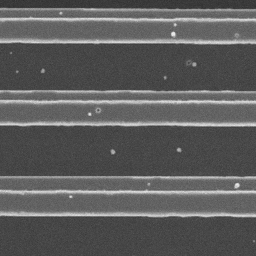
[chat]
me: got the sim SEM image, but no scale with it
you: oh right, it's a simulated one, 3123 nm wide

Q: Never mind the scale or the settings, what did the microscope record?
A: lines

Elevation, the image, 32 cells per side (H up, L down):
LLLLLLLLLLLLLLLLLLLLLLLLLLLLLLLL
HHHHHHHHHHHHHHHHHHHHHHHHHHHHHHHH
HHHHHHHHHHHHHHHHHHHHHHHHHHHHHHHH
HHHHHHHHHHHHHHHHHHHHHHHHHHHHHHHH
HHHHHHHHHHHHHHHHHHHHHHHHHHHHHHHH
LLLLLLLLLLLLLLLLLLLLLLLLLLLLLLLL
LLLLLLLLLLLLLLLLLLLLLLLLLLLLLLLL
LLLLLLLLLLLLLLLLLLLLLLLLLLLLLLLL
LLLLLLLLLLLLLLLLLLLLLLLLLLLLLLLL
LLLLLLLLLLLLLLLLLLLLLLLLLLLLLLLL
LLLLLLLLLLLLLLLLLLLLLLLLLLLLLLLL
HHHHHHHHHHHHHHHHHHHHHHHHHHHHHHHH
HHHHHHHHHHHHHHHHHHHHHHHHHHHHHHHH
HHHHHHHHHHHHHHHHHHHHHHHHHHHHHHHH
HHHHHHHHHHHHHHHHHHHHHHHHHHHHHHHH
HHHHHHHHHHHHHHHHHHHHHHHHHHHHHHHH
LLLLLLLLLLLLLLLLLLLLLLLLLLLLLLLL
LLLLLLLLLLLLLLLLLLLLLLLLLLLLLLLL
LLLLLLLLLLLLLLLLLLLLLLLLLLLLLLLL
LLLLLLLLLLLLLLLLLLLLLLLLLLLLLLLL
LLLLLLLLLLLLLLLLLLLLLLLLLLLLLLLL
LLLLLLLLLLLLLLLLLLLLLLLLLLLLLLLL
HHHHHHHHHHHHHHHHHHHHHHHHHHHHHHHH
HHHHHHHHHHHHHHHHHHHHHHHHHHHHHHHH
HHHHHHHHHHHHHHHHHHHHHHHHHHHHHHHH
HHHHHHHHHHHHHHHHHHHHHHHHHHHHHHHH
HHHHHHHHHHHHHHHHHHHHHHHHHHHHHHHH
LLLLLLLLLLLLLLLLLLLLLLLLLLLLLLLL
LLLLLLLLLLLLLLLLLLLLLLLLLLLLLLLL
LLLLLLLLLLLLLLLLLLLLLLLLLLLLLLLL
LLLLLLLLLLLLLLLLLLLLLLLLLLLLLLLL
LLLLLLLLLLLLLLLLLLLLLLLLLLLLLLLL